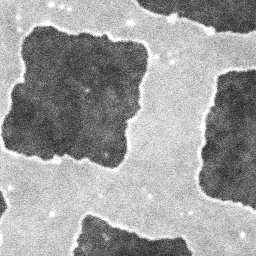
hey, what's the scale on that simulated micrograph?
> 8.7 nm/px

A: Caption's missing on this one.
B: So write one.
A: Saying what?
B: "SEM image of holes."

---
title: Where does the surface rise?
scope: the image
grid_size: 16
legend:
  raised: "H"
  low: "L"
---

HHHHHHHHHLLLLLLL
HHHHHHHHHHHHLLLL
HLLLLLLHHHHHHHHH
HLLLLLLLLHHHHHHH
HLLLLLLLLHHHHHLL
HLLLLLLLLHHHHLLL
HLLLLLLLLHHHHLLL
LLLLLLLLHHHHHLLL
LLLLLLLLHHHHHLLL
HLLLLLLLHHHHHLLL
HHHHHHHHHHHHHLLL
HHHHHHHHHHHHLLLL
HHHHHHHHHHHHHHLL
HHHHHLHHHHHHHHHH
HHHHHLLLHHHHHHHH
HHHHHLLLLLLLHHHH